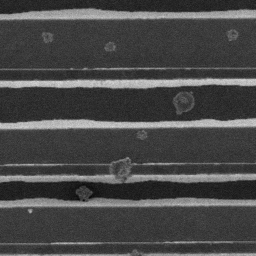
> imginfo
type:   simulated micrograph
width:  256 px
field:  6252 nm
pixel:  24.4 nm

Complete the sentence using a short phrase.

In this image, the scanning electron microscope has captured lines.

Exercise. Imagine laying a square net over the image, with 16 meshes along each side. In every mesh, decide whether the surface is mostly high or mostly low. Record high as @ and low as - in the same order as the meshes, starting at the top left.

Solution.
----------------
@@@@@@@@@@@@@@@@
@@@@@@@@@@@@@@@@
@@@@@@@@@@@@@@@@
@@@@@@@@@@@@@@@@
----------------
----------------
----------------
@@@@@@@@@@@@@@@@
@@@@@@@@@@@@@@@@
@@@@@@@@@@@@@@@@
----------------
----------------
@@@@@@@@@@@@@@@@
@@@@@@@@@@@@@@@@
@@@@@@@@@@@@@@@@